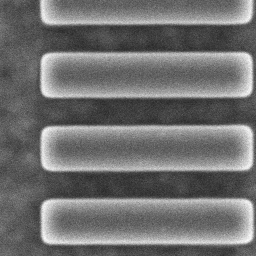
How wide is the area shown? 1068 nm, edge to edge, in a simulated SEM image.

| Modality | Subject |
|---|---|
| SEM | groups of lines, slits or small figures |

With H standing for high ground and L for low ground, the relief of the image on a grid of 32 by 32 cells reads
LLLLLHHHHHHHHHHHHHHHHHHHHHHHHHHL
LLLLLHHHHHHHHHHHHHHHHHHHHHHHHHHL
LLLLLHHHHHHHHHHHHHHHHHHHHHHHHHHL
LLLLLLLLLLLLLLLLLLLLLLLLLLLLLLLL
LLLLLLLLLLLLLLLLLLLLLLLLLLLLLLLL
LLLLLLLLLLLLLLLLLLLLLLLLLLLLLLLL
LLLLLLLLLLLLLLLLLLLLLLLLLLLLLLLL
LLLLLHHHHHHHHHHHHHHHHHHHHHHHHHHL
LLLLLHHHHHHHHHHHHHHHHHHHHHHHHHHL
LLLLLHHHHHHHHHHHHHHHHHHHHHHHHHHL
LLLLLHHHHHHHHHHHHHHHHHHHHHHHHHHL
LLLLLHHHHHHHHHHHHHHHHHHHHHHHHHHL
LLLLLLLLLLLLLLLLLLLLLLLLLLLLLLLL
LLLLLLLLLLLLLLLLLLLLLLLLLLLLLLLL
LLLLLLLLLLLLLLLLLLLLLLLLLLLLLLLL
LLLLLLLLLLLLLLLLLLLLLLLLLLLLLLLL
LLLLLHHHHHHHHHHHHHHHHHHHHHHHHHHL
LLLLLHHHHHHHHHHHHHHHHHHHHHHHHHHL
LLLLLHHHHHHHHHHHHHHHHHHHHHHHHHHL
LLLLLHHHHHHHHHHHHHHHHHHHHHHHHHHL
LLLLLHHHHHHHHHHHHHHHHHHHHHHHHHHL
LLLLLLLLLLLLLLLLLLLLLLLLLLLLLLLL
LLLLLLLLLLLLLLLLLLLLLLLLLLLLLLLL
LLLLLLLLLLLLLLLLLLLLLLLLLLLLLLLL
LLLLLLLLLLLLLLLLLLLLLLLLLLLLLLLL
LLLLLLHHHHHHHHHHHHHHHHHHHHHHHHHL
LLLLLHHHHHHHHHHHHHHHHHHHHHHHHHHH
LLLLLHHHHHHHHHHHHHHHHHHHHHHHHHHH
LLLLLHHHHHHHHHHHHHHHHHHHHHHHHHHH
LLLLLHHHHHHHHHHHHHHHHHHHHHHHHHHH
LLLLLLLLLLLLLLLLLLLLLLLLLLLLLLLL
LLLLLLLLLLLLLLLLLLLLLLLLLLLLLLLL